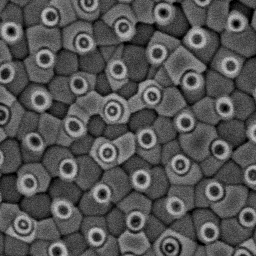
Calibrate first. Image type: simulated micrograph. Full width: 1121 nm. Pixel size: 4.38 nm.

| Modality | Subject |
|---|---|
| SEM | a regular array of ring-shaped raised bodies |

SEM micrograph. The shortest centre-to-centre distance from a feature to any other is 113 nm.